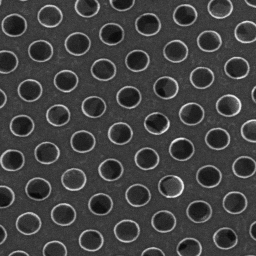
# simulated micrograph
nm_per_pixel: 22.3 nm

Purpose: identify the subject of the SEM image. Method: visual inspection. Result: a regular array of raised bodies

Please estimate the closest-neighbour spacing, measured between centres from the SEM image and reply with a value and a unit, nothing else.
804 nm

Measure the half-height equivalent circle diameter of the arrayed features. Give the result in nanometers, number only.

501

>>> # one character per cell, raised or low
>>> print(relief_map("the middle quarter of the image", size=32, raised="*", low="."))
.......******...*****...........
.......******....***............
***....******...................
***.....****............**......
***....................*****....
***....................*****....
**............****.....*****....
.............******....*****....
......***....******......**.....
.....*****....*****.............
.....*****.....***............**
*....*****...................***
*....*****............**.....***
*....................*****...***
*...................******....**
............****....******......
...........******....****.......
...****....******......*........
..******...******...............
..******....****...........*****
..*****....................*****
...***.............***....******
..................*****....*****
..................******....***.
..........***.....******........
.........*****.....****.........
.***.....******.................
*****....*****..................
*****.....****...........***....
*****...................*****...
*****............***....******..
................*****...******..